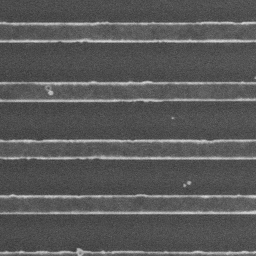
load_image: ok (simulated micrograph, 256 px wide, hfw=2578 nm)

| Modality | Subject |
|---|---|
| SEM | lines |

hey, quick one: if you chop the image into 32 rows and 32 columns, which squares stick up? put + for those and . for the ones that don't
................................
................................
................................
++++++++++++++++++++++++++++++++
++++++++++++++++++++++++++++++++
................................
................................
................................
................................
................................
++++++++++++++++++++++++++++++++
++++++++++++++++++++++++++++++++
++++++++++++++++++++++++++++++++
................................
................................
................................
................................
................................
++++++++++++++++++++++++++++++++
++++++++++++++++++++++++++++++++
................................
................................
................................
................................
.................++.............
++++++++++++++++++++++++++++++++
++++++++++++++++++++++++++++++++
................................
................................
................................
................................
..+..+.+++++..++++......++....+.